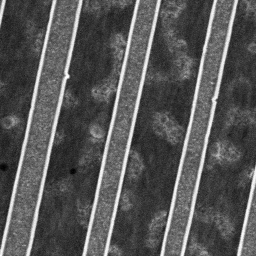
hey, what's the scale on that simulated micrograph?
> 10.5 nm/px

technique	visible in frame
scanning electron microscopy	one or a few lines or trenches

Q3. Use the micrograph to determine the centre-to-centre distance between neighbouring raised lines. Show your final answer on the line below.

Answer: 809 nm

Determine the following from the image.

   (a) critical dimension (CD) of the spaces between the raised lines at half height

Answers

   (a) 579 nanometers